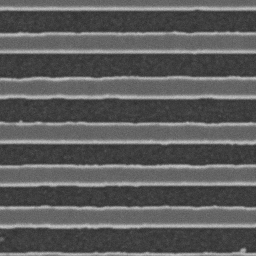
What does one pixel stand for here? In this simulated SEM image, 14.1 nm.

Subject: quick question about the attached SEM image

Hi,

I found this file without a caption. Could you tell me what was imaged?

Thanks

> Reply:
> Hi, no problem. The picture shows lines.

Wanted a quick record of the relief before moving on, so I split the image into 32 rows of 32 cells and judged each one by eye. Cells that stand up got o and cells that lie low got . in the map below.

oooooooooooooooooooooooooooooooo
................................
................................
................................
oooooooooooooooooooooooooooooooo
oooooooooooooooooooooooooooooooo
oooooooooooooooooooooooooooooooo
................................
................................
................................
oooooooooooooooooooooooooooooooo
oooooooooooooooooooooooooooooooo
................................
................................
................................
ooooooooooooooooooooo.oooo.ooooo
oooooooooooooooooooooooooooooooo
oooooooooooooooooooooooooooooooo
................................
................................
................................
oooooooooooooooooooooooooooooooo
oooooooooooooooooooooooooooooooo
................................
................................
................................
oooooooooooooooooooooooooooooooo
oooooooooooooooooooooooooooooooo
................................
................................
................................
................................